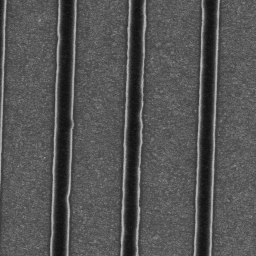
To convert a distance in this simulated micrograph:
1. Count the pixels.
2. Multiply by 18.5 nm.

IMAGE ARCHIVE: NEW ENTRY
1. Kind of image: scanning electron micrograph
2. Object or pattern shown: one or a few lines or trenches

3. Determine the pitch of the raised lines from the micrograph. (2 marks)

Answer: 71.6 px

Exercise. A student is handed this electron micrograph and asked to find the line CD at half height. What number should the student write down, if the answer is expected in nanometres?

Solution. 300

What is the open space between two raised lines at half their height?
997 nm